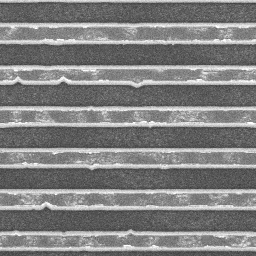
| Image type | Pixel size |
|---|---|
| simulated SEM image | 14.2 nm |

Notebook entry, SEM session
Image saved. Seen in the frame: parallel lines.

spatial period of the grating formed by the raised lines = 589 nm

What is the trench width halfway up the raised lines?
337 nanometers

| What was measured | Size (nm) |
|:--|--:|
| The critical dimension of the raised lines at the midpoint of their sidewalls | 252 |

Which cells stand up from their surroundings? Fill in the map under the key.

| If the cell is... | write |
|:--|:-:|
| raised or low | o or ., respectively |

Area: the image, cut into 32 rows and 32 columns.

................................
................................
................................
oooooooooooooooooooooooooooooooo
oooooooooooooooooooooooooooooooo
................................
................................
................................
oooooooooooooooooooooooooooooooo
oooooooooooooooooooooooooooooooo
................oo..............
................................
................................
...........o....................
oooooooooooooooooooooooooooooooo
oooooooooooooooooooooooooooooooo
................................
................................
................................
oooooooooooooooooooooooooooooooo
oooooooooooooooooooooooooooooooo
................................
................................
................................
oooooooooooooooooooooooooooooooo
oooooooooooooooooooooooooooooooo
................................
................................
................................
oooooooooooooooooooooooooooooooo
oooooooooooooooooooooooooooooooo
................................